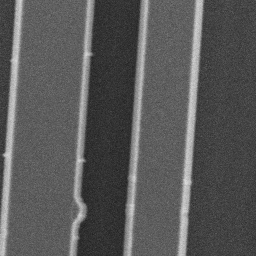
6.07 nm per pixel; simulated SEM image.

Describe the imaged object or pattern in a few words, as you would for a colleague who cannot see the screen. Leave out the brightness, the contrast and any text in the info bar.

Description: one or a few lines or trenches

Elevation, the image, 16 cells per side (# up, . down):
.#####...###....
.#####...###....
.#####...###....
.####....###....
.####....###....
.####....###....
.####....###....
.####...####....
.####...####....
.####...####....
#####...####....
#####...####....
#####...####....
#####...####....
#####...####....
#####...###.....